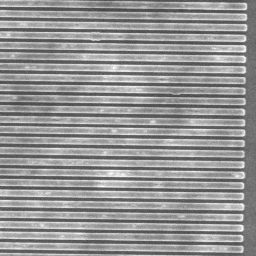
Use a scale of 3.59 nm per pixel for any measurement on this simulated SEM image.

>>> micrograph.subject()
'parallel lines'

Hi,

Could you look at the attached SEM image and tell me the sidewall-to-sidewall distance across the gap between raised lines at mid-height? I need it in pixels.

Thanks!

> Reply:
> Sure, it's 4.12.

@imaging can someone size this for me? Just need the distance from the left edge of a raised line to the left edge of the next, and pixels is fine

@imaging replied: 10.6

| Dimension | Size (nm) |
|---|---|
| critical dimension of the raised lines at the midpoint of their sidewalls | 23.8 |